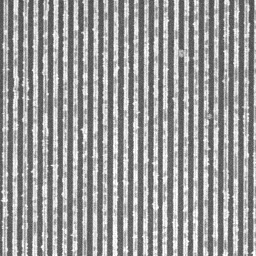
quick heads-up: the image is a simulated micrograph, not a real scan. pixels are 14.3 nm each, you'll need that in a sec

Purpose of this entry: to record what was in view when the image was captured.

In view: parallel lines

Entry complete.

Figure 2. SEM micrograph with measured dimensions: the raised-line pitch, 144 nm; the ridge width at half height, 53.6 nanometers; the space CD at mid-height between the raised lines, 94.7 nm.